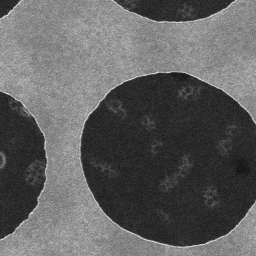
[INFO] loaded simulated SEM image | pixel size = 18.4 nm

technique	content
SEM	holes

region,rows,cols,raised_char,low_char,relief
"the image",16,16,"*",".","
.*******......**
****************
****************
****************
****************
*******.......**
.*****.........*
..***...........
...**...........
...**...........
...**...........
...**...........
..****..........
..*****........*
.*******......**
****************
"